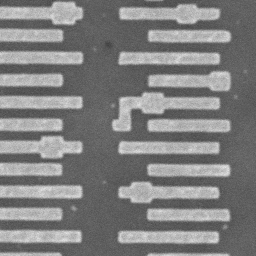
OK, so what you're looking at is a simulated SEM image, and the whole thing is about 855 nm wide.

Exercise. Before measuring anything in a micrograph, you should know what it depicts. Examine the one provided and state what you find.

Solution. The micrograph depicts wiring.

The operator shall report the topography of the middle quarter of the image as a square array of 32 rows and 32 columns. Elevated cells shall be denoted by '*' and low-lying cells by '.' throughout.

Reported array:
................................
................................
................................
.....................***********
.....................***********
..........................******
................................
....................*****.......
****...........**********.......
****..........******************
****..........******************
..............***...*****.......
..............**................
..............***...............
............*****....***********
............*****....***********
.....................***********
................................
................................
................................
****..........******************
****..........******************
................................
................................
................................
.....................***********
.....................***********
.....................***********
................................
................................
.................*****..........
****..........******************